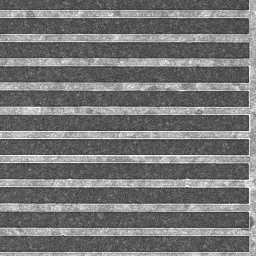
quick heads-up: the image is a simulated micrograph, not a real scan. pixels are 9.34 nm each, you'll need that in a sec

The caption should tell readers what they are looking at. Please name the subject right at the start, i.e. parallel lines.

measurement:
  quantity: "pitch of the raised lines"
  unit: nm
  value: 226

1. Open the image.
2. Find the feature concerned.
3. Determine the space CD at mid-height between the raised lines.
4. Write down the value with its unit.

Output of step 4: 156 nm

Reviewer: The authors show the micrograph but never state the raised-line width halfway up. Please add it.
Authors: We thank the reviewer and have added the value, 68.9 nm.